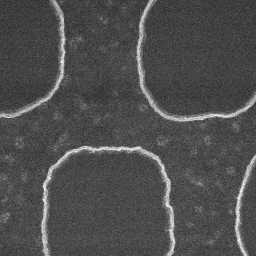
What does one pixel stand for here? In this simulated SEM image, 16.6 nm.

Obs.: raised bodies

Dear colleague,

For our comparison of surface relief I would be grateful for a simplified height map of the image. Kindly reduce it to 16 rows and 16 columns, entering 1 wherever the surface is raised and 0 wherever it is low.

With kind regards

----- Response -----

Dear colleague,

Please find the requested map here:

1111000001111111
1111000001111111
1111000001111111
1111000001111111
1111000001111111
1110000001111111
1100000000111111
0000000000000000
0000000000000000
0000011110000000
0001111111000000
0001111111000001
0001111111000001
0001111111100001
0001111111100001
0001111111100001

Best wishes